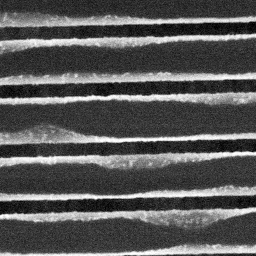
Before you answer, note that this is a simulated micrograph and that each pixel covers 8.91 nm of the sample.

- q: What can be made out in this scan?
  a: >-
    lines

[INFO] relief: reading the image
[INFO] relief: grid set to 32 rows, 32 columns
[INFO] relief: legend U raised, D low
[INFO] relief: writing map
UUUUUUUUUUUUUUUUUUUUUUUUUUUUUUUU
UUUUUUUUUUUUUUUUUUUUUUUUUUUUUUUU
UUUUUUUUUUUUUUUUUUUUUUUUUUUUUUUU
DDDDDDDDDDDDDDDDDDDDDDDDDDDDDDDD
DDDDDDDDDDDDDDDDDDDDDDDDDDDDDUUU
DDUUUUUUUUUUUUUUUUUUUUUUUUUUUUUU
UUUUUUUUUUUUUUUUUUUUUUUUUUUUUUUU
UUUUUUUUUUUUUUUUUUUUUUUUUUUUUUUU
UUUUUUUUUUUUUUUUUUUUUUUUUUUUUUUU
UUUUUUUUUUUUUUUUUUUUUUUUUUUUUUUU
DDDDDDDDDDDDDDDDDDDDDDDDDDDDDDDD
DDDDDDDDDDDDDDDDDDDDDDDDDDDDDDDD
DDDDDDDDUUUUUUUUUUUUUUUUUUUUUUUU
UUUUUUUUUUUUUUUUUUUUUUUUUUUUUUUU
UUUUUUUUUUUUUUUUUUUUUUUUUUUUUUUU
UUUUUUUUUUUUUUUUUUUUUUUUUUUUUUUU
UUUUUUUUUUUUUUUUUUUUUUUUUUUUUUUU
UUDDDDDDDDUUUUUUUUUUDDDDDDDDDDDD
DDDDDDDDDDDDDDDDDDDDDDDDDDDDDDDD
DDDDDDDDDDDDDDDDDDDDDDDUUUUUUUUU
UUUUUUUUUUUUUUUUUUUUUUUUUUUUUUUU
UUUUUUUUUUUUUUUUUUUUUUUUUUUUUUUU
UUUUUUUUUUUUUUUUUUUUUUUUUUUUUUUU
UUUUUUUUUUUUUUUUUUUUUUUUUUUUUUUU
UUUUUUUUUUUUUUUUUDDDDDDDDDDDDDDD
DDDDDDDDDDDDDDDDDDDDDDDDDDDDDDDD
DDDDDDDDDDDDDDDDDDDDDDDDDDDDDUUU
UUUUUUUUUUUUUUUUUUUUUUUUUUUUUUUU
UUUUUUUUUUUUUUUUUUUUUUUUUUUUUUUU
UUUUUUUUUUUUUUUUUUUUUUUUUUUUUUUU
UUUUUUUUUUUUUUUUUUUUUUUUUUUUUUUU
UUUUUUUUUUUUUUUUUUUUUDDDDDDDDDDD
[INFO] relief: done